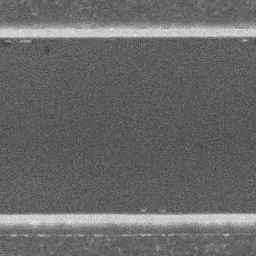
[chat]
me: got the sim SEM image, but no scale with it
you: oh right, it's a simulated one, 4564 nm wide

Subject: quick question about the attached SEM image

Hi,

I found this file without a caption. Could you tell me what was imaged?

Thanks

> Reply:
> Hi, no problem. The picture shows one or a few lines or trenches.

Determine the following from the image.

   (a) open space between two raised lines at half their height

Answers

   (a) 3310 nanometres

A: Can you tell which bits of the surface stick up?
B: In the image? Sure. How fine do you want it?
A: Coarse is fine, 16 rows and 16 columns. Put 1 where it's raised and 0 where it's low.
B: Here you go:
1111111111111111
1111111111111111
0000000000000000
0000000000000000
0000000000000000
0000000000000000
0000000000000000
0000000000000000
0000000000000000
0000000000000000
0000000000000000
0000000000000000
0000000000000000
0000000000000000
1111111111111111
1111111111111111